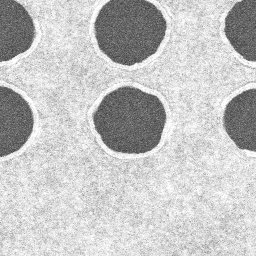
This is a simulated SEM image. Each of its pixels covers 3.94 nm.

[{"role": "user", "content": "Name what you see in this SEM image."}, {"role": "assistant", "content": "holes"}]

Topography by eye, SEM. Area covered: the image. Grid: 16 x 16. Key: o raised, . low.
.ooooo....ooooo.
..oooo....oooo..
..oooo....oooo..
.oooooo..oooooo.
oooooooooooooooo
ooooooo..ooooooo
..oooo....oooo..
..oooo....oooo..
..oooo....oooo..
.oooooo..ooooooo
oooooooooooooooo
oooooooooooooooo
oooooooooooooooo
oooooooooooooooo
oooooooooooooooo
oooooooooooooooo